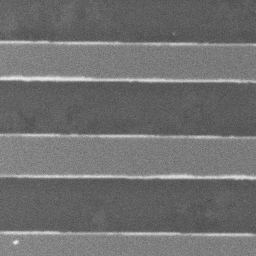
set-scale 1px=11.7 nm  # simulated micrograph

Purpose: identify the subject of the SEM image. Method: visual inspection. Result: lines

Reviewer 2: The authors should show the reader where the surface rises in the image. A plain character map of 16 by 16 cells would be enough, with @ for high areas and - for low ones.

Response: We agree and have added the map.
----------------
----------------
----------------
@@@@@@@@@@@@@@@@
@@@@@@@@@@@@@@@@
----------------
----------------
----------------
@@@@@@@@@@------
@@@@@@@@@@@@@@@@
@@@@@@@@@@@@@@@@
----------------
----------------
----------------
----------------
@@@@@@@@@@@@@@@@